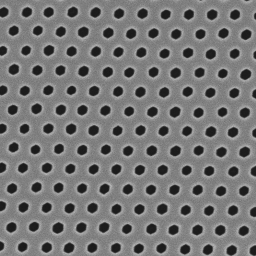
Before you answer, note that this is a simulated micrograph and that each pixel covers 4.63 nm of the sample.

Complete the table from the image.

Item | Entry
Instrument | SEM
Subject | a regular array of holes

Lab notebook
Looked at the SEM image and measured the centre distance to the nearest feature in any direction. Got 103 nm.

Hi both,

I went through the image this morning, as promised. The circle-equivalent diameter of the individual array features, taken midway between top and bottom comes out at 44.4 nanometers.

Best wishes